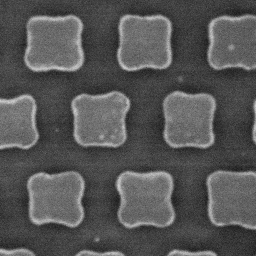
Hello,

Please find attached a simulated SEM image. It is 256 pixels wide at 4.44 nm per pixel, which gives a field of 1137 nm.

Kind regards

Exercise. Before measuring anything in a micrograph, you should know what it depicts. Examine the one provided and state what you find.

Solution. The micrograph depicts raised bodies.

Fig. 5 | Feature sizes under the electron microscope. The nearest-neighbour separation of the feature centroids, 0.392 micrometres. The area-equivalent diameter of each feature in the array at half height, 252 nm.